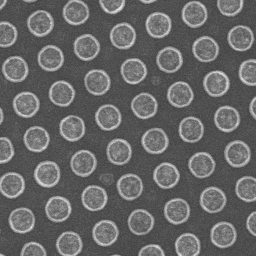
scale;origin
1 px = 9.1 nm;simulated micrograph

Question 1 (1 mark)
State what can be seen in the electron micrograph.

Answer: a regular array of raised bodies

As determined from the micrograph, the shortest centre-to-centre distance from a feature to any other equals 333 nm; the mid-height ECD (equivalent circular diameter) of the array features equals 0.225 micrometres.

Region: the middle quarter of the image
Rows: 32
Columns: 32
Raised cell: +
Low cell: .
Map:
...............+++++....+++++...
..............++++++.....+++....
......++++....++++++............
.....++++++....+++++............
.....++++++.....+++.............
++....+++++................++++.
++....+++++...............++++++
++......+..........++.....++++++
++................++++....++++++
++...............++++++....+++++
..........++.....++++++.....++..
.........++++....++++++.........
........++++++....++++..........
++++....++++++.....+...........+
+++++...++++++...............+++
+++++....++++................+++
+++++.................++.....+++
+++++...............+++++....+++
++++................++++++....++
............+++.....++++++......
...........+++++....++++++......
...........++++++....++++.......
...++++....++++++...............
..++++++...+++++................
..++++++....++++...............+
..++++++................+++....+
..+++++................+++++....
...+++.................++++++...
..............+++++....++++++...
..............+++++....+++++....
..............+++++.....+++.....
.....+++++....+++++.............